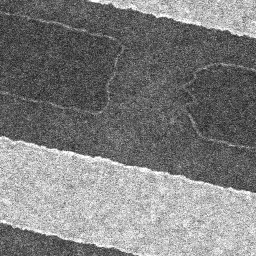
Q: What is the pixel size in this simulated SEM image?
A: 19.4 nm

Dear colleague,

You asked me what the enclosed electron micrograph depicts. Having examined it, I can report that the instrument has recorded one or a few lines or trenches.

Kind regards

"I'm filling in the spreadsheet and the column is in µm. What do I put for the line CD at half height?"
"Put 1.56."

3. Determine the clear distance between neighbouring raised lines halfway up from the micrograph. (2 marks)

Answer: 0.842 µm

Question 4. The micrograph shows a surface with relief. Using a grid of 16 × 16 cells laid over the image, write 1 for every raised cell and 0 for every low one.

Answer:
0000000011111111
1111000000001111
1111111000000000
1111111000000000
1111111000001111
1111111000001111
0001111000001111
0000000000001111
0000000000000111
1111000000000000
1111111110000000
1111111111111000
1111111111111111
1111111111111111
0001111111111111
0000000111111111